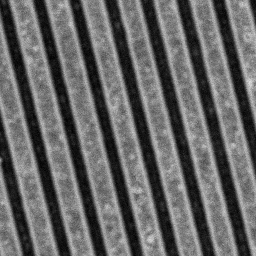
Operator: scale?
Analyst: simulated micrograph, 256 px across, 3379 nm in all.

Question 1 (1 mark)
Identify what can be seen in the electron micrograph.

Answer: parallel lines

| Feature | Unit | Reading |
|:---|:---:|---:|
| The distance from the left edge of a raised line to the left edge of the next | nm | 461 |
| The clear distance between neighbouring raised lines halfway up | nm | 184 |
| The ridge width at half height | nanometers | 279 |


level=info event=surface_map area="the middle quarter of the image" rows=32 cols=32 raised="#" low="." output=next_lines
#####....#####....#####....#####
#####....#####....#####....#####
######...#####....#####....#####
######...######...######...#####
######...######....#####....####
.#####....#####....#####....####
.######...#####....#####....####
.######...######...######...####
.######...######...######....###
..#####....#####....#####....###
..#####....#####....#####....###
..######...######...######...###
..######...######...######...###
...#####....#####....#####....##
...#####....#####....#####....##
...######...#####....######...##
...######...######....#####...##
....#####....#####....#####....#
....#####....#####....#####....#
#...######...#####....######...#
#...######...######...######...#
#....#####....#####....#####....
#....#####....#####....#####....
##...######...#####....#####....
##...######...######...######...
##....#####....#####....#####...
##....#####....#####....#####...
###...######...#####....#####...
###...######...######...######..
###....#####....#####....#####..
###....#####....#####....#####..
####...######...#####....#####..